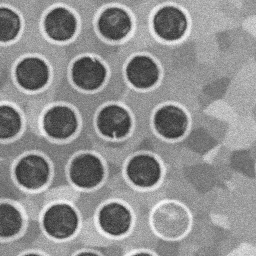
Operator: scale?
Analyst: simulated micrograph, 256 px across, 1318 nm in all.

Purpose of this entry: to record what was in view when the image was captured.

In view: a regular array of holes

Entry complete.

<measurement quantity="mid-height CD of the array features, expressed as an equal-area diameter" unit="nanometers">189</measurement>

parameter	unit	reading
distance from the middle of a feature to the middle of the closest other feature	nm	280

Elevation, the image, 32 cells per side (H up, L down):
HHHHHHHHHHHHHHHHHHHHHHHHHHHHHHHH
LLHHHHLLLHHHHLLLHHHLLLLHHHHHHHHH
LLLHHLLLLLHHLLLLLHHLLLLLHHHHHHHH
LLLHHLLLLLHHLLLLLHHLLLLLHHHHHHHH
LLHHHHLLLHHHHLLLHHHHLLLHHHHHHHHH
HHHHHHHHHHHHHHHHHHHHHHHHHHHHHHHH
HHHHHHHHHHHHHHHHHHHHHHHHHHHHHHHH
HHHLLHHHHLLLLHHHLLLHHHHHHHHHHHHH
HHLLLLHHHLLLLHHHLLLLHHHHHHHHHHHH
HHLLLLHHHLLLLHHHLLLLHHHHHHHHHHHH
HHLLLLHHHLLLLHHHLLLLHHHHHHHHHHHH
HHHHHHHHHHHHHHHHHHHHHHHHHHHHHHHH
HHHHHHHHHHHHHHHHHHHHHHHHHHHHHHHH
LLHHHHLLLHHHHLLLHHHHLLLHHHHHHHHH
LLLHHLLLLLHHLLLLHHHLLLLHHHHHHHHH
LLLHHLLLLLHHLLLLLHHLLLLLHHHHHHHH
LLLHHHLLLLHHLLLLHHHLLLLHHHHHHHHH
LHHHHHHLHHHHHHHHHHHHHLHHHHHHHHHH
HHHHHHHHHHHHHHHHHHHHHHHHHHHHHHHH
HHHLLHHHHLLLHHHHHLLHHHHHHHHHHHHH
HHLLLLHHHLLLLHHHLLLLHHHHHHHHHHHH
HHLLLLHHLLLLLHHHLLLLHHHHHHHHHHHH
HHLLLLHHHLLLLHHHLLLLHHHHHHHHHHHH
HHHLLHHHHHLLHHHHHLLHHHHHHHHHHHHH
HHHHHHHHHHHHHHHHHHHHHHHHHHHHHHHH
LLHHHHHLLHHHHLLHHHHHLLHHHHHHHHHH
LLLHHLLLLLHHLLLLHHHLLLLHHHHHHHHH
LLLHHLLLLLHHLLLLLHHLLLLLHHHHHHHH
LLLHHLLLLLHHLLLLHHHLLLLHHHHHHHHH
LLHHHHLLLHHHHHLHHHHHLLLHHHHHHHHH
HHHHHHHHHHHHHHHHHHHHHHHHHHHHHHHH
HHHHHHHHHHLLHHHHHLLHHHHHHHHHHHHH